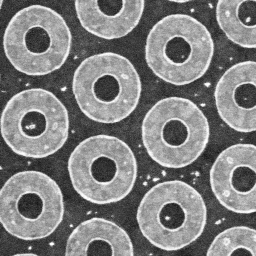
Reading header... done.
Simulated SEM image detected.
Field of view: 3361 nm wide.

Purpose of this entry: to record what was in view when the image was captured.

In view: ring-shaped raised bodies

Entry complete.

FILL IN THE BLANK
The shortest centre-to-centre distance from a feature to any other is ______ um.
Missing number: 1.07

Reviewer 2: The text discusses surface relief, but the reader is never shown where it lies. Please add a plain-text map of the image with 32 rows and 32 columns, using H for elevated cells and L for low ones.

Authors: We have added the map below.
LLLLLLLLLLHHLLLHHHLLLLLLLLLHHHLL
LLLHHHHLLLHHHLLHHHLLLLLLLLLHHHLL
LLHHHHHHLLHHHHHHHLLLHHHHLLLHHHLL
LHHHLHHHLLLHHHHHHLLHHHHHHHLLHHHH
LHHLLLHHHLLLLHHLLLLHHHHHHHLLHHHH
LHHLLLHHHLLLLLLLLLHHHLLLHHHLLLHH
LHHHLLHHLLLLLLLLLLHHHLLLHHHLLLLL
LHHHHHHHLLLHHHHHLLHHHLLHHHLLLLLL
LLHHHHHLLLHHHHHHHLLHHHHHHHLLLHHH
LLLLLLLLLHHHHLHHHLLLHHHHHLLLHHHH
LLLLLLLLLHHHLLLHHLLLLLLLLLLHHHLL
LLLHHHLLLHHHLLLHHLLLLLLLLLLHHLLL
LHHHHHHLLLHHLLHHHLLLHHHLLLLHHLLL
LHHHHHHHLLHHHHHHHLLHHHHHHLLHHHLH
HHHLLLHHLLLHHHHHLLHHHHHHHLLLHHHH
HHLLLLHHLLLLLLLLLLHHHLLHHHLLLHHH
HHHLLLHHLLLLLLLLLLHHLLLLHHLLLLLL
LHHHHHHHLLLHHHHLLLHHLLLHHHLLLLLL
LLHHHHHLLLHHHHHHLLHHHHHHHLLLLHHH
LLLLHLLLLHHHHHHHHLLHHHHHHLLHHHHH
LLLLLLLLLHHLLLLHHLLLHHHHLLLHHHHH
LLLHLLLLLHHLLLLHHLLLLLLLLLHHHLLL
LHHHHHLLLHHHLLHHHLLLLLLLLLHHHLLL
HHHHHHHLLHHHHHHHLLLHHHHHLLLHHLLL
HHHLLHHHLLHHHHHLLLHHHHHHHLLHHHHH
HHLLLHHHLLLLLLLLLLHHHLHHHLLLHHHH
HHLLLHHHLLLLLLLLLHHHLLLHHHLLLLHL
HHHHHHHHLLLHHLLLLHHHLLLHHHLLLLLL
LHHHHHHLLLHHHHHLLLHHHLHHHLLLLHHL
LLHHHHLLLHHHHHHHLLHHHHHHHLLHHHHH
LLLLLLLLHHHLLLHHLLLHHHHLLLLHHHHH
LLLLLLLLHHHLLLHHHLLLLLLLLLHHHLLH